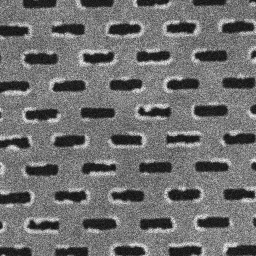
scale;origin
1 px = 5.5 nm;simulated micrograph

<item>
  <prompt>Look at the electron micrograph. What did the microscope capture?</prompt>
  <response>a regular array of holes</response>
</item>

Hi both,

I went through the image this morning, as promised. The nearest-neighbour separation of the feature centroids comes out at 212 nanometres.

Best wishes